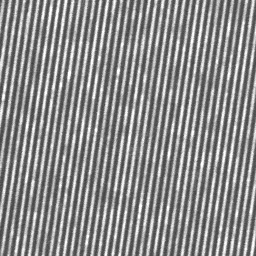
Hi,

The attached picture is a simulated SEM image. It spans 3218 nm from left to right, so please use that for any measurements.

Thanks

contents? parallel lines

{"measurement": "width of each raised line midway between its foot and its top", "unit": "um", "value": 0.0265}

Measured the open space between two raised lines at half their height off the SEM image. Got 60.7 nanometers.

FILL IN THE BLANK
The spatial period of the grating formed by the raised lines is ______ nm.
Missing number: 86.4